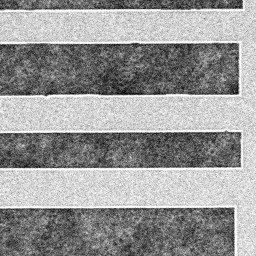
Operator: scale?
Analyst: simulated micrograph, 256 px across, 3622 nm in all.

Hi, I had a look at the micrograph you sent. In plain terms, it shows one or a few lines or trenches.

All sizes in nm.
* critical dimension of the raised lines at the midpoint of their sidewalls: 501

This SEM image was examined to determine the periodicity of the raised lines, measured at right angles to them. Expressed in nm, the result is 1140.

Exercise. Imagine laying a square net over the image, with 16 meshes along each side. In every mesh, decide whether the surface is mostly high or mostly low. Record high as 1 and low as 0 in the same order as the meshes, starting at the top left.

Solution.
0000000000000001
1111111111111111
1111111111111111
0000000000000001
0000000000000001
0000000000000001
1111111111111111
1111111111111111
0000000000000001
0000000000000001
0000000000000001
1111111111111111
1111111111111111
0000000000000001
0000000000000001
0000000000000001